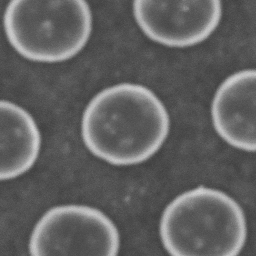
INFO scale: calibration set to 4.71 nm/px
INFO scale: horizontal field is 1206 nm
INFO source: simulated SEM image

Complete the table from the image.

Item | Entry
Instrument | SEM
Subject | raised bodies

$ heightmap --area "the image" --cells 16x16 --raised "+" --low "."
.++++....+++++..
++++++...++++...
.++++.....++....
..++............
................
.......++.....++
......++++...+++
++...+++++...+++
++...+++++....++
++....+++.......
++..............
................
...........+++..
...+++....+++++.
..+++++...+++++.
..+++++....++++.